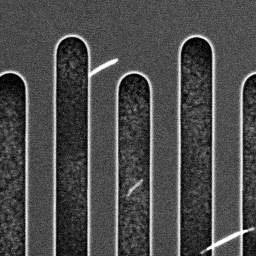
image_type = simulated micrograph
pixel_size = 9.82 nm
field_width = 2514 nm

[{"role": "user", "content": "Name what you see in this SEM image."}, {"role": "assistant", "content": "groups of lines, slits or small figures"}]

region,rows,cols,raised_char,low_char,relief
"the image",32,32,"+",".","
++++++++++++++++++++++++++++++++
++++++++++++++++++++++++++++++++
++++++++++++++++++++++++++++++++
++++++++++++++++++++++++++++++++
++++++++++++++++++++++++++++++++
+++++++....++++++++++++...++++++
+++++++....++++++++++++...++++++
+++++++....++++++++++++....+++++
+++++++....++++++++++++....+++++
..+++++....+++++..+++++....++++.
...++++....++++....++++....+++..
...++++....++++....++++....+++..
...++++....++++....++++....+++..
...++++....++++....++++....+++..
...++++....++++....++++....+++..
...++++....++++....++++....+++..
...++++....++++....++++....+++..
...++++....++++....++++....+++..
...++++....++++....++++....+++..
...++++....++++....++++....+++..
...++++....++++....++++....+++..
...++++....++++....++++....+++..
...++++....++++....++++....+++..
...++++....++++....++++....+++..
...++++....++++....++++....+++..
...++++....++++....+++.....+++..
...++++....++++....+++.....+++..
...++++....++++....+++.....+++..
...++++....++++....+++.....+++..
...++++....++++....+++.....+++..
...++++....++++....+++....++++..
...++++....++++....+++.....+++..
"